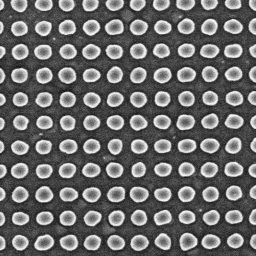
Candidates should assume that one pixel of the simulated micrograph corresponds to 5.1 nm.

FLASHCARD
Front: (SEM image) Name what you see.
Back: a regular array of raised bodies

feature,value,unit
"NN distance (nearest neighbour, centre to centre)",118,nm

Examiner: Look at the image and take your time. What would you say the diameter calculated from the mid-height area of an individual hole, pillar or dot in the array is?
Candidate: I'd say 0.077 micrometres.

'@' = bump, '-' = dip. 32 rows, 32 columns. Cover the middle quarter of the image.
--------------------------------
@@----@@----@@----@@----@@---@@@
@@@--@@@@--@@@@--@@@---@@@@--@@@
@@@--@@@@--@@@---@@@---@@@@--@@@
@@---------@@----@@-----@-------
--------------------------------
--------------------------------
@@----@@----@@---@@@---@@@---@@@
@@@--@@@@--@@@@--@@@@--@@@---@@@
@@@--@@@@--@@@---@@@@--@@@---@@@
@@----@@----------@@----------@@
--------------------------------
--------------------------------
@@---@@@---@@@---@@@---@@@---@@@
@@@--@@@@--@@@@-@@@@@--@@@--@@@@
@@---@@@@--@@@---@@@@--@@@--@@@@
--------------------------------
--------------------------------
--------------------------------
@@@---@@---@@@---@@@---@@@---@@@
@@@--@@@@--@@@---@@@@--@@@@--@@@
@@@--@@@@--@@@---@@@---@@@---@@@
--------------------------------
--------------------------------
--------------------------------
@@@--@@@---@@@---@@@---@@@---@@@
@@@--@@@@--@@@@--@@@---@@@@--@@@
@@---@@@---@@@---@@@---@@@---@@@
--------------------------------
--------------------------------
--------------------------------
@@@--@@@----@@@--@@@@--@@@---@@@